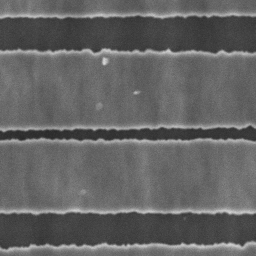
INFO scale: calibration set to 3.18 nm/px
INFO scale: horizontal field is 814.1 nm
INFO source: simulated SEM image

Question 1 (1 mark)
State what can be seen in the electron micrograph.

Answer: lines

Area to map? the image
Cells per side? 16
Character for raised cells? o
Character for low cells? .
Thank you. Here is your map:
oooooooooooooooo
................
................
oooooooooooooooo
oooooooooooooooo
oooooooooooooooo
oooooooooooooooo
oooooooooooooooo
oooooooooooooooo
oooooooooooooooo
oooooooooooooooo
oooooooooooooooo
oooooooooooooooo
................
................
.ooooooooooooooo